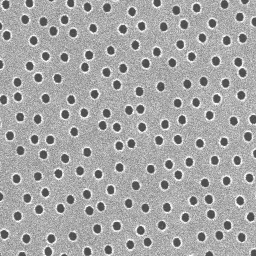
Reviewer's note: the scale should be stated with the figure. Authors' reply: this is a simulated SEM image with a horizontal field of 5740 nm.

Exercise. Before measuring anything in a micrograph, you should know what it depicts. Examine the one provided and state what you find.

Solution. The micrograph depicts a regular array of holes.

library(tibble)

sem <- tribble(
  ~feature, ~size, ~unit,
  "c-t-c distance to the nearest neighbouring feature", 396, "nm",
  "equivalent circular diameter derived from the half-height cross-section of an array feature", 194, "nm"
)